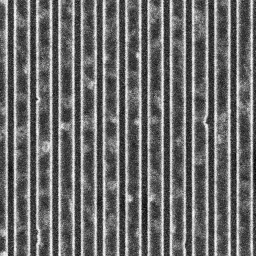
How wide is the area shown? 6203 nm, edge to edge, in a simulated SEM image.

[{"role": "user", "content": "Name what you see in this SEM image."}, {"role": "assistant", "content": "parallel lines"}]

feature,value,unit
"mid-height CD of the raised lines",15.5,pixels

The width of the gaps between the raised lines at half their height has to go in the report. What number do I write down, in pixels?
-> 6.88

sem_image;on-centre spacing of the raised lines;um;0.539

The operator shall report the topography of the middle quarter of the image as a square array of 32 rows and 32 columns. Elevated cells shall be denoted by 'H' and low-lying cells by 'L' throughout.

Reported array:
HHLLLHHHLLHHHHLLHHHLLHHHHLLHHHLL
HHLLLHHHLLHHHHLLHHHLLHHHHLLHHHLL
HHLLLHHHLLHHHHLLHHHLLHHHHLLHHHLL
HHLLLHHHLLHHHHLLHHHLLHHHHLLHHHLL
HHLLLHHHLLHHHHLLHHHLLHHHHLLHHHLL
HHLLLHHHLLHHHHLLHHHLLHHHHLLHHHLL
HHLLLHHHLLHHHHLLHHHLLHHHHLLHHHLL
HHLLLHHHLLHHHHLLHHHLLHHHHLLHHHLL
HHLLLHHHLLHHHHLLHHHLLHHHHLLHHHLL
HHLLLHHHLLHHHHLLHHHLLHHHHLLHHHLL
HHLLLHHHLLHHHHLLHHHLLHHHHLLHHHLL
HHLLLHHHLLHHHHLLHHHLLHHHHLLHHHLL
HHLLLHHHLLHHHHLLHHHLLHHHHLLHHHLL
HHLLLHHHLLHHHHLLHHHLLHHHHLLHHHLL
HHLLLHHHLLHHHHLLHHHLLHHHHLLHHHLL
HHLLLHHHLLHHHHLLHHHLLHHHHLLHHHLL
HHLLLHHHLLHHHHLLHHHLLHHHHLLHHHLL
HHLLLHHHLLHHHHLLHHHLLHHHHLLHHHLL
HHLLLHHHLLHHHHLLHHHLLHHHHLLHHHLL
HHLLLHHHLLHHHHLLHHHLLHHHHLLHHHLL
HHLLLHHHLLHHHHLLHHHLLHHHHLLHHHLL
HHLLLHHHLLHHHHLLHHHLLHHHHLLHHHLL
HHLLLHHHLLHHHHLLHHHLLHHHHLLHHHLL
HHLLLHHHLLHHHHLLHHHLLHHHHLLHHHLL
HHLLLHHHLLHHHHLLHHHLLHHHHLLHHHLL
HHLLLHHHLLHHHHLLHHHLLHHHHLLHHHLL
HHLLLHHHLLHHHHLLHHHLLHHHHLLHHHLL
HHLLLHHHLLHHHHLLHHHLLHHHHLLHHHLL
HHLLLHHHLLHHHHLLHHHLLHHHHLLHHHLL
HHLLLHHHLLHHHHLLHHHLLHHHHLLHHHLL
HHLLLHHHLLHHHHLLHHHLLHHHHLLHHHLL
HHLLLHHHLLHHHHLLHHHLLHHHHLLHHHLL